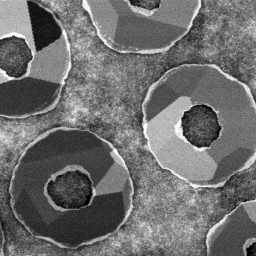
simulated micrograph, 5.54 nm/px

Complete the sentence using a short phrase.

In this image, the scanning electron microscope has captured ring-shaped raised bodies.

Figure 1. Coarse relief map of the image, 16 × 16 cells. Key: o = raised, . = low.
ooo..ooo..oo....
oooo..oooooo....
.ooo..ooooo.....
..oo............
..oo.......ooo..
oooo......ooooo.
ooo......ooooooo
.........oo...oo
...ooo...ooo..oo
..ooooo..ooooooo
.ooooooo..ooooo.
.oo...oo....oo..
.oo...oo........
.ooooooo......oo
..ooooo......ooo
....o........oo.